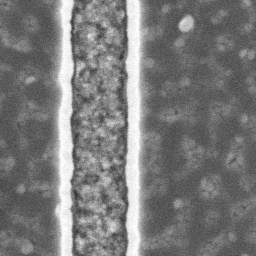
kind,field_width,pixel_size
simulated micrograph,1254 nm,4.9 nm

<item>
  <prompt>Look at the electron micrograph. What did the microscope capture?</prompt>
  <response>one or a few lines or trenches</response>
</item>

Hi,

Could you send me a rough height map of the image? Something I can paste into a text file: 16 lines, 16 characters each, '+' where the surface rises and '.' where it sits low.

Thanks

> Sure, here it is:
++++....++++++++
++++....++++++++
++++....++++++++
++++....++++++++
++++....++++++++
++++....++++++++
++++....++++++++
++++....++++++++
++++....++++++++
++++....++++++++
++++....++++++++
++++....++++++++
++++....++++++++
++++....++++++++
++++....++++++++
++++....++++++++